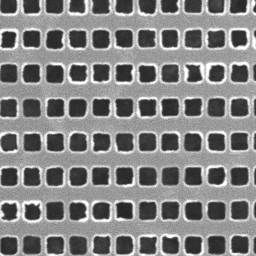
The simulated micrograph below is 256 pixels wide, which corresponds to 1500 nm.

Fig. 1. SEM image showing a regular array of holes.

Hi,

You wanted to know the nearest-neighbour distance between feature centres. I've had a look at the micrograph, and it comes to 0.134 um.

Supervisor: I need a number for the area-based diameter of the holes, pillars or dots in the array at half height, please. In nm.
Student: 114